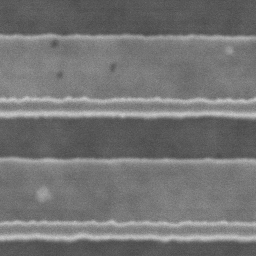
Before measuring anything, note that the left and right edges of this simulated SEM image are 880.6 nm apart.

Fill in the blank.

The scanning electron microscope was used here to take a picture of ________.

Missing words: lines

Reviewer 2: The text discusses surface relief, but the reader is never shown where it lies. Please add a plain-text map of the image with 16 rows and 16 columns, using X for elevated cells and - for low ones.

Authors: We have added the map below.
----------------
----------------
XXXXXXXXXXXXXXXX
XXXXXXXXXXXXXXXX
XXXXXXXXXXXXXXXX
XXXXXXXXXXXXXXXX
XXXXXXXXXXXXXXXX
----------------
----------------
----------------
XXXXXXXXXXXXXXXX
XXXXXXXXXXXXXXXX
XXXXXXXXXXXXXXXX
XXXXXXXXXXXXXXXX
XXXXXXXXXXXXXXXX
----------------